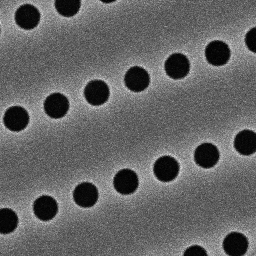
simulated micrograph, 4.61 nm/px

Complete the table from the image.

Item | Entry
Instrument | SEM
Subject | a regular array of holes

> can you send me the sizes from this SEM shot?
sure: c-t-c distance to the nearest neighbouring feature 42.3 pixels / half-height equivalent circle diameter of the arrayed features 122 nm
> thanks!